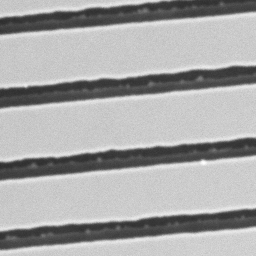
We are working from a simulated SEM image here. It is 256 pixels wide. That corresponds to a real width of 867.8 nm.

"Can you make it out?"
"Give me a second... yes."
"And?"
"lines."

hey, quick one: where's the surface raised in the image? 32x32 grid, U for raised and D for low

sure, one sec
UUUUUUUUUUUUUUUUUUDDDDDDDDDDDDDD
UUUUUUUDDDDDDDDDDDDDDDDDDDDDDDDD
DDDDDDDDDDDDDDDDDDDDDUUUUUUUUUUU
DDDDDDDDDDUUUUUUUUUUUUUUUUUUUUUU
UUUUUUUUUUUUUUUUUUUUUUUUUUUUUUUU
UUUUUUUUUUUUUUUUUUUUUUUUUUUUUUUU
UUUUUUUUUUUUUUUUUUUUUUUUUUUUUUUU
UUUUUUUUUUUUUUUUUUUUUUUUUUUUUUUU
UUUUUUUUUUUUUUUUUUUUUUUUUUUUDDDD
UUUUUUUUUUUUUUUUUUDDDDDDDDDDDDDD
UUUUUUUDDDDDDDDDDDDDDDDDDDDDDDDD
DDDDDDDDDDDDDDDDDDDDDDUUUUUUUUUU
DDDDDDDDDDDUUUUUUUUUUUUUUUUUUUUU
DUUUUUUUUUUUUUUUUUUUUUUUUUUUUUUU
UUUUUUUUUUUUUUUUUUUUUUUUUUUUUUUU
UUUUUUUUUUUUUUUUUUUUUUUUUUUUUUUU
UUUUUUUUUUUUUUUUUUUUUUUUUUUUUUUU
UUUUUUUUUUUUUUUUUUUUUUUUUUUUUDDD
UUUUUUUUUUUUUUUUUDDDDDDDDDDDDDDD
UUUUUUUUDDDDDDDDDDDDDDDDDDDDDDDU
DDDDDDDDDDDDDDDDDDDDDUUUUUUUUUUU
DDDDDDDDDDDUUUUUUUUUUUUUUUUUUUUU
UUUUUUUUUUUUUUUUUUUUUUUUUUUUUUUU
UUUUUUUUUUUUUUUUUUUUUUUUUUUUUUUU
UUUUUUUUUUUUUUUUUUUUUUUUUUUUUUUU
UUUUUUUUUUUUUUUUUUUUUUUUUUUUUUUU
UUUUUUUUUUUUUUUUUUUUUUUUUUUUDDDD
UUUUUUUUUUUUUUUUUDDDDDDDDDDDDDDD
UUUUDDDDDDDDDDDDDDDDDDDDDDDDDDDU
DDDDDDDDDDDDDDDDDDDDUUUUUUUUUUUU
DDDDDDDDDUUUUUUUUUUUUUUUUUUUUUUU
UUUUUUUUUUUUUUUUUUUUUUUUUUUUUUUU